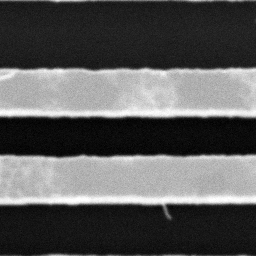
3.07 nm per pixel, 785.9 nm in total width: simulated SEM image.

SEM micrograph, lines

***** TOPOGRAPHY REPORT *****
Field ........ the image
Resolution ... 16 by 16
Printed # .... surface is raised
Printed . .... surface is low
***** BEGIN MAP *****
................
................
................
................
################
################
################
................
................
................
################
################
################
................
................
................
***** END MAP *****